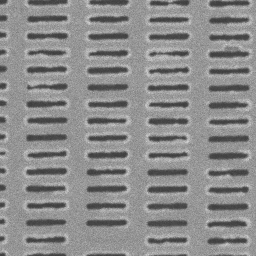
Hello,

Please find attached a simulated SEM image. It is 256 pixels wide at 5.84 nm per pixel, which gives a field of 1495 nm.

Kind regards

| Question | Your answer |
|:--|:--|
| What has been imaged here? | a regular array of holes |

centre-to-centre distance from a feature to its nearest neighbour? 16.8 pixels